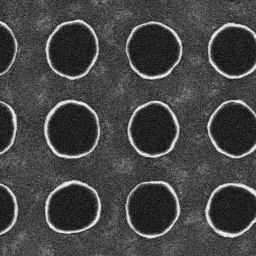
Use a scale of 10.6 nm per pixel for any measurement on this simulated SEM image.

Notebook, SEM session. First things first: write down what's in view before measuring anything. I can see raised bodies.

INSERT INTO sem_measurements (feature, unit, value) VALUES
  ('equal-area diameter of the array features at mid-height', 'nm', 576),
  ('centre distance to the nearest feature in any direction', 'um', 0.839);